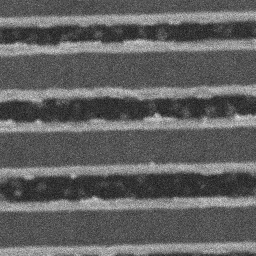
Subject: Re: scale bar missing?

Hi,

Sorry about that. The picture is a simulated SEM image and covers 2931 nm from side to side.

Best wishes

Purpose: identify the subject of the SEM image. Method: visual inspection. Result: one or a few lines or trenches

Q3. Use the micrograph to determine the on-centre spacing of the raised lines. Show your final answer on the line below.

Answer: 0.88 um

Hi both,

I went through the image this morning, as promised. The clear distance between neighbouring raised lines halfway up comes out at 502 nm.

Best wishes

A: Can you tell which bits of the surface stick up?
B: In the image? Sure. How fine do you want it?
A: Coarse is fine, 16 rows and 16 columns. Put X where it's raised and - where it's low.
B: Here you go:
----------------
XXXXXXXXXXXXXXXX
XXXXXXXXXXXXXXXX
----------------
----------------
----------------
XXXXXXXXXXXXXXXX
XXXXXXXXXXXXXXXX
----------------
----------------
---------X-X-XXX
XXXXXXXXXXXXXXXX
XXXXXXXXXXXXXXXX
----------------
----------------
----------XX-XXX